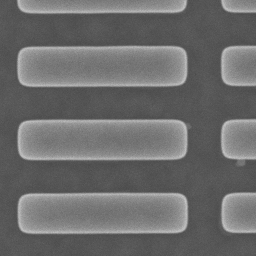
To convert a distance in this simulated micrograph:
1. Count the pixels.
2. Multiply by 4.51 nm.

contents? groups of lines, slits or small figures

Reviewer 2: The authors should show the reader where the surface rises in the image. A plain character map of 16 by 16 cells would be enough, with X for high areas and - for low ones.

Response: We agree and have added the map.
-XXXXXXXXXX---XX
----------------
----------------
-XXXXXXXXXXX--XX
-XXXXXXXXXXX--XX
----------------
----------------
----------------
-XXXXXXXXXXX--XX
-XXXXXXXXXXX--XX
----------------
----------------
-XXXXXXXXXXX--XX
-XXXXXXXXXXX--XX
--XXXXXXXXX----X
----------------